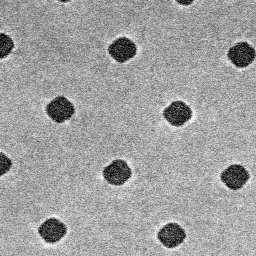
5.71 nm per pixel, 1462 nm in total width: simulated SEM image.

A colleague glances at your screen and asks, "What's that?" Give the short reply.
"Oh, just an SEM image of holes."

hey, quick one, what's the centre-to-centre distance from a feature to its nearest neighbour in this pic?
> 481 nanometers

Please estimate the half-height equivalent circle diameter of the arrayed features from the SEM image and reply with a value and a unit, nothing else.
27.8 px